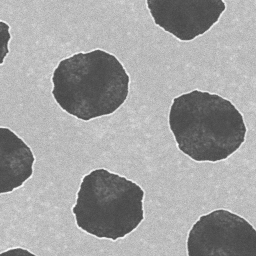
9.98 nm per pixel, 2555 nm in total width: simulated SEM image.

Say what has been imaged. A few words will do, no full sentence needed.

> holes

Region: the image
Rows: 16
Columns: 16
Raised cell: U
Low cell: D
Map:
UUUUUUUUUDDDDDUU
UUUUUUUUUUDDDUUU
DUUUUUUUUUUUUUUU
UUUUUDDUUUUUUUUU
UUUDDDDDUUUUUUUU
UUUDDDDDUUUUUUUU
UUUUDDDDUUUDDDUU
UUUUUUUUUUUDDDDU
DUUUUUUUUUUDDDDU
DDUUUUUUUUUDDDDU
DDUUUUUUUUUUUUUU
DUUUUDDDUUUUUUUU
UUUUUDDDDUUUUUUU
UUUUUDDDDUUUUDDU
UUUUUDDDUUUUDDDD
UUUUUUUUUUUUDDDD